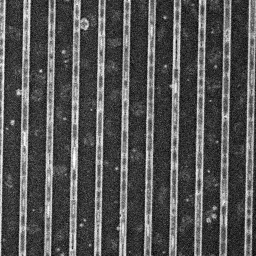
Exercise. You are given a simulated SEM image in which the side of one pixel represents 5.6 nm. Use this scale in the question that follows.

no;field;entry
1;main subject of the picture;parallel lines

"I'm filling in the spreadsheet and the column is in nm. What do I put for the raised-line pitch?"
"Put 140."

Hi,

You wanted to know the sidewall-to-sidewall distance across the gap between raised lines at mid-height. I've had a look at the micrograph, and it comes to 19 pixels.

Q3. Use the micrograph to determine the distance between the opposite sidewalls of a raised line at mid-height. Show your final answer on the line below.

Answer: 34.3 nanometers